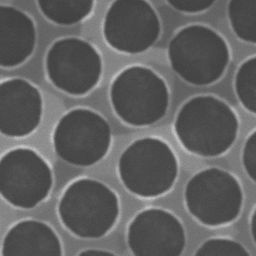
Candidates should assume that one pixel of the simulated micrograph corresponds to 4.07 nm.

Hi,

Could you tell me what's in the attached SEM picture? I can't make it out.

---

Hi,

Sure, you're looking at a regular array of holes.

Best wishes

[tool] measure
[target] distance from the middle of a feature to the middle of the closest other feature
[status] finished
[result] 290 nm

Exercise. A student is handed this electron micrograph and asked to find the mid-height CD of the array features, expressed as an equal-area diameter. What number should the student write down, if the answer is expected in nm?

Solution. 239